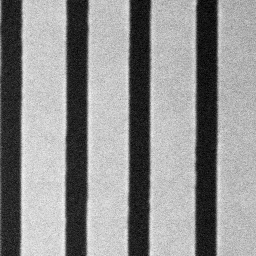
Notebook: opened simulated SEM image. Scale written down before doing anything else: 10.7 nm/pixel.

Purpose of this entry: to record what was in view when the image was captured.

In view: lines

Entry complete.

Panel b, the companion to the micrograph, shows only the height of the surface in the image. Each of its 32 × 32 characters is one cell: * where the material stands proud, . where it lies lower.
...*****...*****...******..*****
...*****...*****...*****...*****
...*****...*****...*****...*****
...*****...*****...*****...*****
...*****...*****...*****...*****
...*****...*****...*****...*****
...*****...*****...*****...*****
...*****...*****...*****...*****
...*****...*****...*****...*****
...*****...*****...*****...*****
...*****...*****...*****...*****
...*****...*****...*****...*****
...*****...*****...*****...*****
...*****...*****...*****...*****
...*****...*****...*****...*****
...*****...*****...*****...*****
...*****...*****...*****...*****
...*****...*****...*****...*****
...*****...*****...*****...*****
...*****...*****...*****...*****
...*****...*****...*****...*****
...*****...*****...*****...*****
...*****...*****...*****...*****
...*****...*****...*****...*****
...*****...*****...*****...*****
...*****...*****...*****...*****
...*****...*****...*****...*****
...*****...*****...*****...*****
...*****...*****...*****...*****
...*****...*****...*****...*****
...*****...*****...*****...*****
...*****...*****...*****...*****